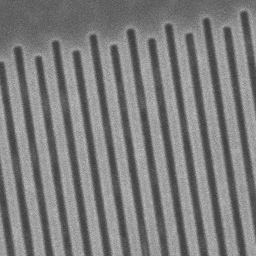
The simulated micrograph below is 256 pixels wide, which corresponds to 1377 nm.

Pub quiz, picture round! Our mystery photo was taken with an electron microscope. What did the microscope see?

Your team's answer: parallel lines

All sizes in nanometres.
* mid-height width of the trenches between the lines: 46.5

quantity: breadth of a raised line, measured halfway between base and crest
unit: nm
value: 55.8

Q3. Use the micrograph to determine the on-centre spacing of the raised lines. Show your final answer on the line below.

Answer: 102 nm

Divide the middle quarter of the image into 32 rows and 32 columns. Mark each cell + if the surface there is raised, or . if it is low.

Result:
++...++...++..+++..+++..++...++.
+++..++...++...++..+++..+++..++.
+++..+++..++...++..+++..+++..+++
+++..+++..++...++...++..+++..+++
.++..+++..+++..++...++...++..+++
.++...++..+++..+++..++...++...++
.++...++..+++..+++..+++..++...++
.++...++...++..+++..+++..+++..++
.+++..++...++...++..+++..+++..++
.+++..+++..++...++...++..+++..++
.+++..+++..+++..++...++...++..++
.+++..+++..+++..+++..++...++...+
..++...++..+++..+++..+++..+++..+
..++...++...++..+++..+++..+++..+
..+++..++...++...++..+++..+++..+
..+++..+++..++...++...++..+++..+
..+++..+++..+++..++...++..+++..+
...++..+++..+++..++...++...++..+
...++...++..+++..+++..++...++...
+..++...++..+++..+++..+++..++...
+..+++..+++..++..+++..+++..+++..
+..+++..+++..++...++..+++..+++..
+..+++..+++..++...++...++..+++..
+..+++..+++..+++..++...++...++..
+...++..+++..+++..+++..++...++..
+...++...++..+++..+++..+++..++..
++..++...++...++..+++..+++..+++.
++..+++..++...++...++..+++..+++.
++..+++..+++..++...++...++..+++.
++..+++..+++..+++..++...++..+++.
++...++..+++..+++..+++..++...++.
++...++...++..+++..+++..++...++.